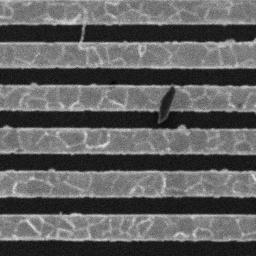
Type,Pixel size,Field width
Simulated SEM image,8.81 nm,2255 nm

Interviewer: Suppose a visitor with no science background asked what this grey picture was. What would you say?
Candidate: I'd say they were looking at lines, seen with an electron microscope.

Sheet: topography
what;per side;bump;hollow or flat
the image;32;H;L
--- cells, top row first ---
HHHHHHHHHHHHHHHHHHHHHHHHHHHHHHHH
HHHHHHHHHHHHHHHHHHHHHHHHHHHHHHHH
HHHHHHHHHHHHHHHHHHHHHHHHHHHHHHHH
LLLLLLLLLLLLLLLLLLLLLLLLLLLLLLLL
LLLLLLLLLLLLLLLLLLLLLLLLLLLLLLLL
HHHHHHHHHHHHHHHHHHHHHHHHHHHHHHHH
HHHHHHHHHHHHHHHHHHHHHHHHHHHHHHHH
HHHHHHHHHHHHHHHHHHHHHHHHHHHHHHHH
LLLLLLLLLLLLLLLLLLLLLLLLLLLLLLLL
LLLLLLLLLLLLLLLLLLLLLLLLLLLLLLLL
LLLLLLLLLLLLLLLLLLLLLLLLLLLLLLLL
HHHHHHHHHHHHHHHHHHHHHHHHHHHHHHHH
HHHHHHHHHHHHHHHHHHHHHHHHHHHHHHHH
HHHHHHHHHHHHHHHHHHHHHHHHHHHHHHHH
LLLLLLLLLLLLLLLLLLLLHLLLLLLLLLLL
LLLLLLLLLLLLLLLLLLLLLLLLLLLLLLLL
HHHHHHHHHHHHHHHHHHHHHHHHHHHHHHHH
HHHHHHHHHHHHHHHHHHHHHHHHHHHHHHHH
HHHHHHHHHHHHHHHHHHHHHHHHHHHHHHHH
LLLLLLLLLLLLLLLLLLLLLLLLLLLLLLLL
LLLLLLLLLLLLLLLLLLLLLLLLLLLLLLLL
HHHHHHHHHHLLLHHLHLHHHHHHHHHLLHHH
HHHHHHHHHHHHHHHHHHHHHHHHHHHHHHHH
HHHHHHHHHHHHHHHHHHHHHHHHHHHHHHHH
HHHHHHHHHHHHHHHHHHHHHHHHHHHHHHHH
LLLLLLLLLLLLLLLLLLLLLLLLLLLLLLLL
LLLLLLLLLLLLLLLLLLLLLLLLLLLLLLLL
HHHHHHHHHHHHHHHHHHHHHHHHHHHHHHHH
HHHHHHHHHHHHHHHHHHHHHHHHHHHHHHHH
HHHHHHHHHHHHHHHHHHHHHHHHHHHHHHHH
LLLLLLLLLLLLLLLLLLLLLLLLLLLLLLLL
LLLLLLLLLLLLLLLLLLLLLLLLLLLLLLLL